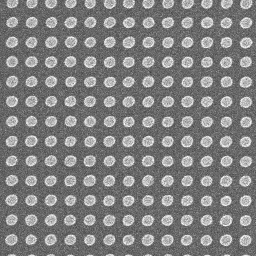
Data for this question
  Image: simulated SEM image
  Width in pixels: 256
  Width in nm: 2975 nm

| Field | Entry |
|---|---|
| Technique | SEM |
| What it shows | a regular array of raised bodies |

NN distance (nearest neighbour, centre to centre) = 223 nm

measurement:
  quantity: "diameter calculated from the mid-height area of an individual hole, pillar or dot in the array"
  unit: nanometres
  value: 122